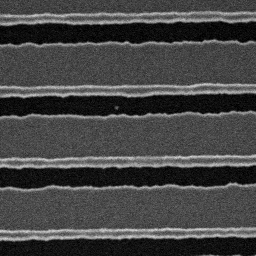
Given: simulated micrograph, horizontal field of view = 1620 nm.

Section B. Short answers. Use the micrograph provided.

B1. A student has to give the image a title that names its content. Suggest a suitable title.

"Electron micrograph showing lines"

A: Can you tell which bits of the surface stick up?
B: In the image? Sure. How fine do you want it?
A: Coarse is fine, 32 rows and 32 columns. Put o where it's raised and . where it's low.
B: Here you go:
oooooooooooooooooooooooooooooooo
oooooooooooooooooooooooooooooooo
oooooooooooooooooooooooooooooooo
................................
................................
...o..oo.oooooooo.oooooooooooooo
oooooooooooooooooooooooooooooooo
oooooooooooooooooooooooooooooooo
oooooooooooooooooooooooooooooooo
oooooooooooooooooooooooooooooooo
oooooooooooooooooooooooooooooooo
oooooooooooooooooooooooooooooooo
................................
................................
...ooo.ooo....oo..oooooooooooooo
oooooooooooooooooooooooooooooooo
oooooooooooooooooooooooooooooooo
oooooooooooooooooooooooooooooooo
oooooooooooooooooooooooooooooooo
oooooooooooooooooooooooooooooooo
oooooooooooooooooooooooooooooooo
................................
................................
oo...ooooooooooooooooooooooooooo
oooooooooooooooooooooooooooooooo
oooooooooooooooooooooooooooooooo
oooooooooooooooooooooooooooooooo
oooooooooooooooooooooooooooooooo
oooooooooooooooooooooooooooooooo
oooooooooooooooooooooooooooooooo
................................
................................